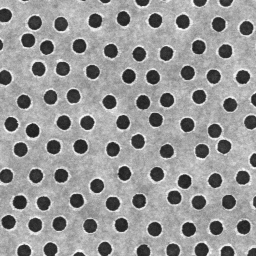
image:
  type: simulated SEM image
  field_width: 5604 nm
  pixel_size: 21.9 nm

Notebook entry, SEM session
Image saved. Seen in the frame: a regular array of holes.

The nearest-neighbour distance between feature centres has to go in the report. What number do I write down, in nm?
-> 539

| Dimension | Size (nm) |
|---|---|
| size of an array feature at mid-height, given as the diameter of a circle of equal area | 327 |